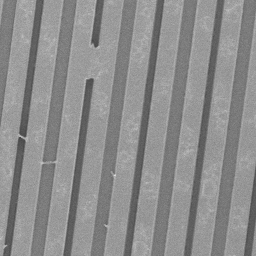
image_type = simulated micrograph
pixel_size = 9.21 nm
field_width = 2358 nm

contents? parallel lines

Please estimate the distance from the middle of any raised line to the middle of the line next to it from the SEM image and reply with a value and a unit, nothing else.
0.275 microns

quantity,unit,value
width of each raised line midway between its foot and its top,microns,0.172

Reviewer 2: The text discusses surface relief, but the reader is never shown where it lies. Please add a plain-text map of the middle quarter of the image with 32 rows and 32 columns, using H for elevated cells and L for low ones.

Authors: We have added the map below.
LHHHHHHHHHHHHLLLHHHHHLLHHHHHLLLH
LHHHHHHHHHHHHLLLHHHHHLLHHHHHLLLH
LHHHHHHHHHHHLLLLHHHHHLLHHHHLLLLH
LHHHHHHHHHHHLLLLHHHHHLLHHHHLLLLH
LHHHHLLHHHHHLLLLHHHHLLLHHHHLLLLH
LHHHHLLHHHHHLLLLHHHHLLHHHHHLLLLH
LHHHHLLHHHHHLLLHHHHHLLHHHHHLLLLH
HHHHHLLHHHHHLLLHHHHHLLHHHHHLLLLH
HHHHHLLHHHHHLLLHHHHHLLHHHHHLLLHH
HHHHHLLHHHHHLLLHHHHHLLHHHHLLLLHH
HHHHHLLHHHHLLLLHHHHHLLHHHHLLLLHH
HHHHLLHHHHHLLLLHHHHHLLHHHHLLLLHH
HHHHLLHHHHHLLLLHHHHLLLHHHHLLLLHH
HHHHLLHHHHHLLLLHHHHLLHHHHHLLLLHH
HHHHLLHHHHHLLLHHHHHLLHHHHHLLLLHH
HHHHLLHHHHHLLLHHHHHLLHHHHHLLLHHH
HHHHLLHHHHHLLLHHHHHLLHHHHHLLLHHH
HHHHLLHHHHLLLLHHHHHLLHHHHLLLLHHH
HHHHLLHHHHLLLLHHHHHLLHHHHLLLLHHH
HHHLLHHHHHLLLLHHHHHLLHHHHLLLLHHH
HHHLLHHHHHLLLLHHHHLLHHHHHLLLLHHH
HHHLLHHHHHLLLLHHHHLLHHHHHLLLLHHH
HHHLLHHHHHLLLHHHHHLLHHHHHLLLLHHH
HHHLLHHHHHLLLHHHHHLLHHHHHLLLHHHH
HHHLLHHHHHLLLHHHHHLLHHHHHLLLHHHH
HHHLLHHHHLLLLHHHHHLLHHHHLLLLHHHH
HHLLLHHHHLLLLHHHHHLLHHHHLLLLHHHH
HHLLHHHHHLLLLHHHHHLLHHHHLLLLHHHH
HHLLHHHHHLLLHHHHHLLHHHHHLLLLHHHH
HHLLHHHHHLLLHHHHHLLHHHHHLLLLHHHH
HHLLHHHHHLLLHHHHHLLHHHHHLLLLHHHH
HHLLHHHHHLLLHHHHHLLHHHHHLLLHHHHH